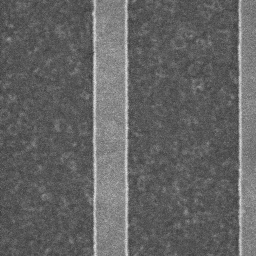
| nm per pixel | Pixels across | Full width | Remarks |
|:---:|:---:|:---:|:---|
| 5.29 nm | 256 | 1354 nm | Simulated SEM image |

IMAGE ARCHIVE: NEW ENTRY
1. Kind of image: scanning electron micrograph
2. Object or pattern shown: one or a few lines or trenches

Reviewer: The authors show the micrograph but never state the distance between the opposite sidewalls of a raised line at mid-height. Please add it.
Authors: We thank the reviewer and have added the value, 169 nm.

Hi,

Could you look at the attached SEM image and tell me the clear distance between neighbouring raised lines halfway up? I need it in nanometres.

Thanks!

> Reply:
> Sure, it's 598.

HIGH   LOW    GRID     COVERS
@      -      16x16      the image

------@@-------@
------@@-------@
------@@-------@
------@@-------@
------@@-------@
------@@-------@
------@@-------@
------@@-------@
------@@-------@
------@@-------@
------@@-------@
------@@-------@
------@@-------@
------@@-------@
------@@-------@
------@@-------@